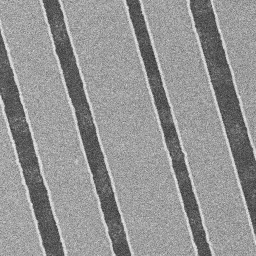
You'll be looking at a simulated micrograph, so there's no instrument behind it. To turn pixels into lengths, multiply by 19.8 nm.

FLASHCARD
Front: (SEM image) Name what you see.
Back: one or a few lines or trenches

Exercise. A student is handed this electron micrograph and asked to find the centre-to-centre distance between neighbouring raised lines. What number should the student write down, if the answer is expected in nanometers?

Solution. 1400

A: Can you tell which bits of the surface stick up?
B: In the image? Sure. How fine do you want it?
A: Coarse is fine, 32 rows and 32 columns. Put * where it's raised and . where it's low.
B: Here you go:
*****...********..******...*****
******..********..******...*****
******..********..******...*****
******..*********.******...*****
******...********..******...****
.******..********..******...****
.******..********..******...****
.******...********..*****...****
..******..********..******...***
..******..********..******...***
..******...*******..******...***
...*****...********..******...**
...******..********..******...**
...******..********..******...**
*..******...********..******...*
*...******..********..******...*
*...******..********..******...*
**..******..********...*****...*
**..******...********..******...
**...******..********..******...
**...******..********..******...
***..******...********..******..
***...******..********..******..
***...******..********..******..
****..******..********...*****..
****..******...********..******.
****...******..********..******.
****...******..********..******.
*****..******...********..*****.
*****...******..********..******
*****...******..********..******
******..******..*********..*****